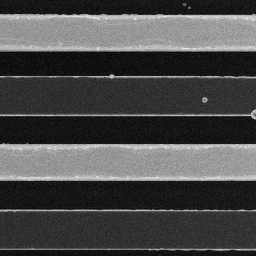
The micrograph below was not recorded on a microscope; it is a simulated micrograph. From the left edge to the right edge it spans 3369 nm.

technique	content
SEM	lines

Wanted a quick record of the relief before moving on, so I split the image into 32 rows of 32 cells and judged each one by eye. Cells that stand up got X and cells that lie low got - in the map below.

--------------------------------
--------------------------------
XXXXXXXXXXXXXXXXXXXXXXXXXXXXXXXX
XXXXXXXXXXXXXXXXXXXXXXXXXXXXXXXX
XXXXXXXXXXXXXXXXXXXXXXXXXXXXXXXX
XXXXXXXXXXXXXXXXXXXXXXXXXXXXXXXX
--------------------------------
--------------------------------
--------------------------------
-------------XX-----------------
XXXXXXXXXXXXXXXXXXXXXXXXXXXXXXXX
XXXXXXXXXXXXXXXXXXXXXXXXXXXXXXXX
XXXXXXXXXXXXXXXXXXXXXXXXXXXXXXXX
XXXXXXXXXXXXXXXXXXXXXXXXXXXXXXXX
-------------------------------X
--------------------------------
--------------------------------
--------------------------------
XXXXXXXXXXXXXXXXXXXXXXXXXXXXXXXX
XXXXXXXXXXXXXXXXXXXXXXXXXXXXXXXX
XXXXXXXXXXXXXXXXXXXXXXXXXXXXXXXX
XXXXXXXXXXXXXXXXXXXXXXXXXXXXXXXX
---X-X--------XXXX-----X--------
--------------------------------
--------------------------------
--------------------------------
XXXXXXXXXXXXXXXXXXXXXXXXXXXXXXXX
XXXXXXXXXXXXXXXXXXXXXXXXXXXXXXXX
XXXXXXXXXXXXXXXXXXXXXXXXXXXXXXXX
XXXXXXXXXXXXXXXXXXXXXXXXXXXXXXXX
XXXXXXXXXXXXXXXXXXXXXXXXXXXXXXXX
--------------------------------